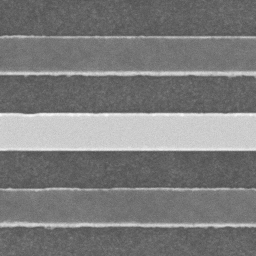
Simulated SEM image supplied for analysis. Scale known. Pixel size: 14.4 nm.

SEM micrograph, lines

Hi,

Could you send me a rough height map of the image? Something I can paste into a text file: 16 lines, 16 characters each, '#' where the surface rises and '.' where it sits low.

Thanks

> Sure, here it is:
................
................
################
################
################
................
................
################
################
................
................
................
################
################
................
................